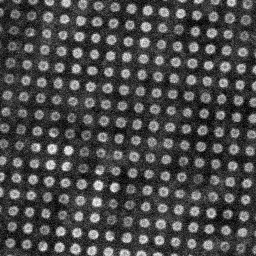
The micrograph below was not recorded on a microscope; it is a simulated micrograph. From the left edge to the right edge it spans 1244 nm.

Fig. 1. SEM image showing a regular array of raised bodies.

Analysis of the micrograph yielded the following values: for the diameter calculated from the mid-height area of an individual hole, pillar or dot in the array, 41.1 nm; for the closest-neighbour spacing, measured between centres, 0.0779 µm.